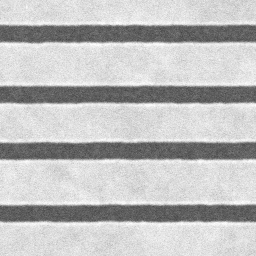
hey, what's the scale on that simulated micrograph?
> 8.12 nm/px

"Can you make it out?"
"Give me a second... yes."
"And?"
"lines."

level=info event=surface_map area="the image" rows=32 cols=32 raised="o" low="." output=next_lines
oooooooooooooooooooooooooooooooo
oooooooooooooooooooooooooooooooo
oooooooooooooooooooooooooooooooo
................................
................................
oooo.ooooooooooooooooooooooooooo
oooooooooooooooooooooooooooooooo
oooooooooooooooooooooooooooooooo
oooooooooooooooooooooooooooooooo
oooooooooooooooooooooooooooooooo
oooooooooooooooooooooooooooooooo
................................
................................
oooooooooooooooooooooooooooooooo
oooooooooooooooooooooooooooooooo
oooooooooooooooooooooooooooooooo
oooooooooooooooooooooooooooooooo
oooooooooooooooooooooooooooooooo
................................
................................
oooooooooooooooooooooooooooooooo
oooooooooooooooooooooooooooooooo
oooooooooooooooooooooooooooooooo
oooooooooooooooooooooooooooooooo
oooooooooooooooooooooooooooooooo
oooooooooooooo.oooooooooooo.ooo.
................................
................................
oooooooooooooooooooooooooooooooo
oooooooooooooooooooooooooooooooo
oooooooooooooooooooooooooooooooo
oooooooooooooooooooooooooooooooo